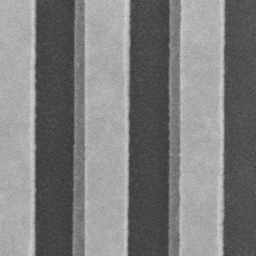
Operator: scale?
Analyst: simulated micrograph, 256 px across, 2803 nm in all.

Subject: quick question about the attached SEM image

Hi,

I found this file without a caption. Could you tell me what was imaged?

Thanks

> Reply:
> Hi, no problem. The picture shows lines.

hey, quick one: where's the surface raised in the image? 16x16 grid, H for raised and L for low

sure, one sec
HHLLLHHHLLLHHHLL
HHLLLHHHLLLHHHLL
HHLLLHHHLLLHHHLL
HHLLLHHHLLLHHHLL
HHLLLHHHLLLHHHLL
HHLLLHHHLLLHHHLL
HHLLLHHHLLLHHHLL
HHLLLHHHLLLHHHLL
HHLLLHHHLLLHHHLL
HHLLLHHHLLLHHHLL
HHLLLHHHLLLHHHLL
HHLLLHHHLLLHHHLL
HHLLLHHHLLLHHHLL
HHLLLHHHLLLHHHLL
HHLLLHHHLLLHHHLL
HHLLLHHHLLLHHHLL